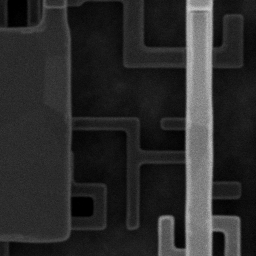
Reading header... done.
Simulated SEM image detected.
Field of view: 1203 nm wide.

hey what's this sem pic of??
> wiring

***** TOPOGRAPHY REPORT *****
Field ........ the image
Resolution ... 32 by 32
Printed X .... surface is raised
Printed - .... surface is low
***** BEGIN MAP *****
-----XXX---------------XXXX-----
-----XXX---------------XXXX-----
-----XXX---------------XXXX-----
XXXXXXXXX--------------XXXX-----
XXXXXXXXX--------------XXXX-----
XXXXXXXXX--------------XXXX-----
XXXXXXXXX--------------XXX------
XXXXXXXXX--------------XXX------
XXXXXXXXX--------------XXX------
XXXXXXXXX--------------XXX------
XXXXXXXXX--------------XXX------
XXXXXXXXX--------------XXX------
XXXXXXXXX--------------XXX------
XXXXXXXXX--------------XXXX-----
XXXXXXXXX--------------XXXX-----
XXXXXXXXX--------------XXXX-----
XXXXXXXXX--------------XXXX-----
XXXXXXXXX--------------XXXX-----
XXXXXXXXX--------------XXXX-----
XXXXXXXXX--------------XXXX-----
XXXXXXXXX--------------XXXX-----
XXXXXXXXX--------------XXXX-----
XXXXXXXXX--------------XXXX-----
XXXXXXXXX--------------XXX------
XXXXXXXXX--------------XXX------
XXXXXXXXX--------------XXX------
XXXXXXXXX--------------XXX------
XXXXXXXXX--------------XXX------
XXXXXXXXX--------------XXX------
XXXXXXXXX--------------XXX------
-----------------------XXX------
-----------------------XXX------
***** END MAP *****